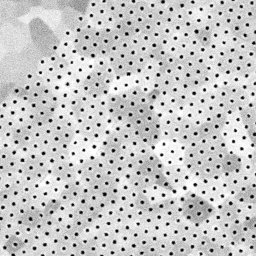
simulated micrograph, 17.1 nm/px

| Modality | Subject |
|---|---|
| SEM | a regular array of holes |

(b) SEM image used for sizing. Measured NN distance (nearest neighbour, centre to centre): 184 nanometres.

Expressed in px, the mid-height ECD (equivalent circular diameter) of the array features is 4.37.